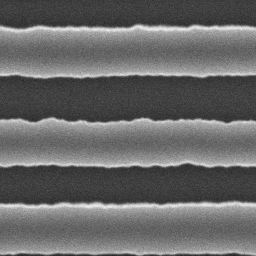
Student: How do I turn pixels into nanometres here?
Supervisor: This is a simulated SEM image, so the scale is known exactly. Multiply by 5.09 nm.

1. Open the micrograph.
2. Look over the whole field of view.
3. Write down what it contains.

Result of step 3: lines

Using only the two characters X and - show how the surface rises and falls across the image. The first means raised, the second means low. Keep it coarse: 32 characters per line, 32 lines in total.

--------------------------------
--------------------------------
--------------------------------
----XX-----------X------XXXX-XX-
XXXXXXXXXXXXXXXXXXXXXXXXXXXXXXXX
XXXXXXXXXXXXXXXXXXXXXXXXXXXXXXXX
XXXXXXXXXXXXXXXXXXXXXXXXXXXXXXXX
XXXXXXXXXXXXXXXXXXXXXXXXXXXXXXXX
XXXXXXXXXXXXXXXXXXXXXXXXXXXXXXXX
---XXXXXXXXXX-----------XX------
--------------------------------
--------------------------------
--------------------------------
--------------------------------
--------------------------------
XXXXXXXXXXXXXXXXXXXXXXXXXXXXXXXX
XXXXXXXXXXXXXXXXXXXXXXXXXXXXXXXX
XXXXXXXXXXXXXXXXXXXXXXXXXXXXXXXX
XXXXXXXXXXXXXXXXXXXXXXXXXXXXXXXX
XXXXXXXXXXXXXXXXXXXXXXXXXXXXXXXX
XXXXX-XXXXXXXXXXXXXXXXX-XXXXXXXX
--------------------------------
--------------------------------
--------------------------------
--------------------------------
----------------------------XXX-
XXXXXXXXXXXXXXXXXXXXXXXXXXXXXXXX
XXXXXXXXXXXXXXXXXXXXXXXXXXXXXXXX
XXXXXXXXXXXXXXXXXXXXXXXXXXXXXXXX
XXXXXXXXXXXXXXXXXXXXXXXXXXXXXXXX
XXXXXXXXXXXXXXXXXXXXXXXXXXXXXXXX
XXXXXXXXXXXXXXXXXXXXXXXXXXXXXXXX